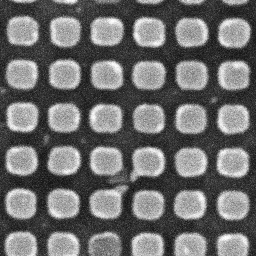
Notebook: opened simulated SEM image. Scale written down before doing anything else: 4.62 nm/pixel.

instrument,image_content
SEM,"a regular array of raised bodies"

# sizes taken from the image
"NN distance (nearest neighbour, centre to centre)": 194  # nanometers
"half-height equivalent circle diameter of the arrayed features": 140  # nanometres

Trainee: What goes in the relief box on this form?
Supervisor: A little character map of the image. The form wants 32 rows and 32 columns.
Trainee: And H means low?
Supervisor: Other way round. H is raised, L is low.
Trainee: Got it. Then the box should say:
LLLLLLLLLLLLLLLLLLLLLLLLLLLLLLLL
LLLLLLLLLLLLLLLLLLLLLLLLLLLLLLLL
LHHHLLLHHLLLHHHLLHHLLLLHHLLLLHLL
LHHHHLHHHHLLHHHLLHHHLLHHHHLHHHHL
LHHHHLHHHHLLHHHLLHHHLLHHHHLHHHHL
LLLLLLLHHLLLHLLLLLHHLLLHHLLLHHHL
LLLLLLLLLLLLLLLLLLLLLLLLLLLLLLLL
LLLLLLLLLLLLLLLLLLLLLLLLLLLLLLLL
LHHHHLHHHHLLHHHLLHHHLLHHHHLLHHHL
LHHHHLHHHHLLHHHLLHHHHLHHHHLHHHHL
LHHHLLLHHHLLHHHLLHHHLLHHHHLLHHHL
LLLLLLLLLLLLLLLLLLLLLLLLLLLLLLLL
LLLLLLLLLLLLLLLLLLLLLLLLLLLLLLLL
LHHHLLHHHLLLHHHLLHHHLLLHHLLLHHLL
LHHHHLHHHHLHHHHLLHHHLLHHHHLHHHHL
LHHHLLHHHHLHHHHLLHHHLLHHHHLHHHHL
LLLLLLLLLLLLLLLLLLLHLLLHHLLLHHLL
LLLLLLLLLLLLLLLLLLLLLLLLLLLLLLLL
LLHHLLLHHLLLLLLLLLLLLLLLLLLLLLLL
LHHHHLHHHHLLHHHLLHHHLLHHHHLHHHHL
LHHHHLHHHHLHHHHLLHHHLLHHHHLHHHHL
LHHHLLLHHLLLHHHLLHHHLLHHHLLLHHHL
LLLLLLLLLLLLLLLLLLLLLLLLLLLLLLLL
LLLLLLLLLLLLLLLHLLLLLLLLLLLLLLLL
LHHHLLHHHHLLHHHLLHHHLLHHHHLLHHHL
LHHHLLHHHHLHHHHLLHHHLLHHHHLHHHHL
LHHHLLHHHHLLHHHLLHHHLLHHHLLHHHHL
LLLLLLLLLLLLLLLLLLLLLLLLLLLLLLLL
LLLLLLLLLLLLLLLLLLLLLLLLLLLLLLLL
LHHHLLLHHLLLLLLLLHHHLLLHHLLLHHLL
LHHHLLHHHHLLLLLLLHHHLLHHHHLHHHHL
LHHHLLHHHHLLLLLLLHHHLLHHHLLHHHHL